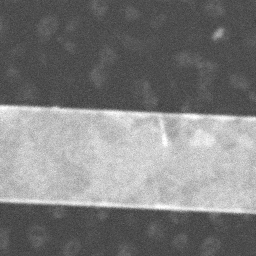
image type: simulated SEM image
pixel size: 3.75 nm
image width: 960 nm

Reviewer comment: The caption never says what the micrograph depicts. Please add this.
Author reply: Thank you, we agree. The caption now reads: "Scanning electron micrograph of one or a few lines or trenches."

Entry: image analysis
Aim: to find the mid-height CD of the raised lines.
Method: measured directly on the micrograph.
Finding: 354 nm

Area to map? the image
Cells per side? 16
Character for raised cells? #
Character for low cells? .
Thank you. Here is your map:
................
................
................
................
................
................
................
################
################
################
################
################
################
................
................
................